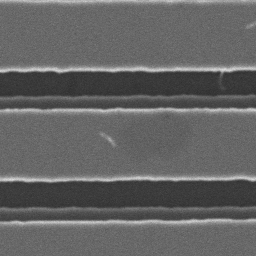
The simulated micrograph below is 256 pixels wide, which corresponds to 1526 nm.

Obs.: lines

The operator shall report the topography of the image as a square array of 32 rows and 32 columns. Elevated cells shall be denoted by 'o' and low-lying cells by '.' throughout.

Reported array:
oooooooooooooooooooooooooooooooo
oooooooooooooooooooooooooooooooo
oooooooooooooooooooooooooooooooo
oooooooooooooooooooooooooooooooo
oooooooooooooooooooooooooooooooo
oooooooooooooooooooooooooooooooo
oooooooooooooooooooooooooooooooo
oooooooooooooooooooooooooooooooo
oooooooooooooooooooooooooooooooo
................................
................................
................................
................................
................................
oooooooooooooooooooooooooooooooo
oooooooooooooooooooooooooooooooo
oooooooooooooooooooooooooooooooo
oooooooooooooooooooooooooooooooo
oooooooooooooooooooooooooooooooo
oooooooooooooooooooooooooooooooo
oooooooooooooooooooooooooooooooo
oooooooooooooooooooooooooooooooo
ooooooooo.ooooo................o
................................
................................
................................
................................
........................ooooo..o
oooooooooooooooooooooooooooooooo
oooooooooooooooooooooooooooooooo
oooooooooooooooooooooooooooooooo
oooooooooooooooooooooooooooooooo